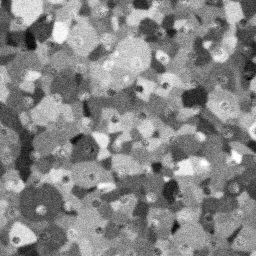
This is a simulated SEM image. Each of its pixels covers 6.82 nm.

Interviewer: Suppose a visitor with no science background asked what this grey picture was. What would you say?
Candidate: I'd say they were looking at a regular array of holes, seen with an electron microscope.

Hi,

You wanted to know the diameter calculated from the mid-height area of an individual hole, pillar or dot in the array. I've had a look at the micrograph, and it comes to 62.5 nm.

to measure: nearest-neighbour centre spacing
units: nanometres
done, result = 185